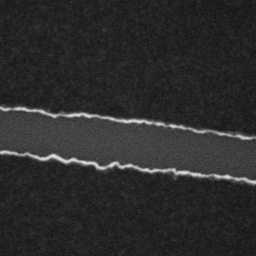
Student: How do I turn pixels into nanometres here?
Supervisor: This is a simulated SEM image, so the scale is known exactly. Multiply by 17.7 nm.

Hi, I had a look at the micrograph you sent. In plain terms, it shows one or a few lines or trenches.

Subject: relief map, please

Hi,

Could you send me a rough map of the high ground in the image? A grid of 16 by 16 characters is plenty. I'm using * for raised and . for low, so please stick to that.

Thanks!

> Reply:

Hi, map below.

****************
****************
****************
****************
****************
****************
****************
.......*********
...............*
................
*********.......
****************
****************
****************
****************
****************